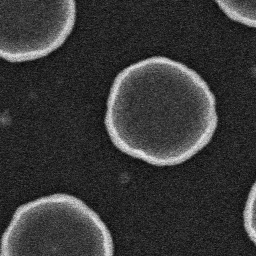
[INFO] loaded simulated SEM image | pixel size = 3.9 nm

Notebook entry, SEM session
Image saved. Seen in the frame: raised bodies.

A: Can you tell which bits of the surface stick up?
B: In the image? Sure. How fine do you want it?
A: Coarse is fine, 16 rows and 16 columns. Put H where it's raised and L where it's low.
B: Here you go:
HHHHHLLLLLLLLLHH
HHHHLLLLLLLLLLLL
HHHHLLLLLLLLLLLL
HHLLLLLLLLLLLLLL
LLLLLLLLHHHHLLLL
LLLLLLLHHHHHHLLL
LLLLLLLHHHHHHLLL
LLLLLLLHHHHHHLLL
LLLLLLLHHHHHHLLL
LLLLLLLLHHHHLLLL
LLLLLLLLLLLLLLLL
LLLLLLLLLLLLLLLL
LLLHHLLLLLLLLLLL
LHHHHHLLLLLLLLLH
HHHHHHHLLLLLLLLL
HHHHHHHLLLLLLLLL